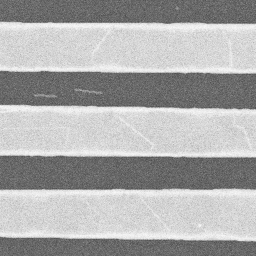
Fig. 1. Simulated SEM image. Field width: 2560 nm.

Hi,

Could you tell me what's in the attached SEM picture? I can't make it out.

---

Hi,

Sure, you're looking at lines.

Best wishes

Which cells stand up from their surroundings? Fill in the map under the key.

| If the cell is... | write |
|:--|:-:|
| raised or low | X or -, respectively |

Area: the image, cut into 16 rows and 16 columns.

----------------
XXXXXXX---------
XXXXXXXXXXXXXXXX
XXXXXXXXXXXXXXXX
----------------
----------------
----------------
XXXXXXXXXXXXXXXX
XXXXXXXXXXXXXXXX
XXXXXXXXXXXXXXXX
----------------
----------------
XXXXXXXXXXXXXXXX
XXXXXXXXXXXXXXXX
XXXXXXXXXXXXXXXX
----------------